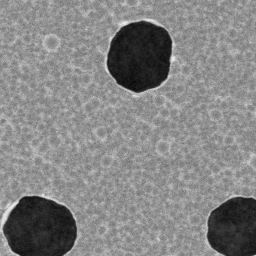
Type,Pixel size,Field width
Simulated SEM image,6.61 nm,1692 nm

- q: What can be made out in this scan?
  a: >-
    holes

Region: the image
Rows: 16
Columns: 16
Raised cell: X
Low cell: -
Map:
XXXXXXXXXXXXXXXX
XXXXXXXX--XXXXXX
XXXXXXX----XXXXX
XXXXXXX----XXXXX
XXXXXXX----XXXXX
XXXXXXXX--XXXXXX
XXXXXXXXXXXXXXXX
XXXXXXXXXXXXXXXX
XXXXXXXXXXXXXXXX
XXXXXXXXXXXXXXXX
XXXXXXXXXXXXXXXX
XXXXXXXXXXXXXXXX
X--XXXXXXXXXXX--
-----XXXXXXXX---
-----XXXXXXXX---
X---XXXXXXXXX---